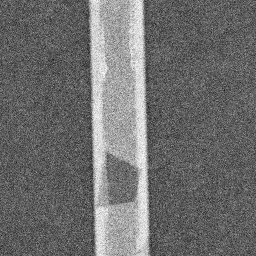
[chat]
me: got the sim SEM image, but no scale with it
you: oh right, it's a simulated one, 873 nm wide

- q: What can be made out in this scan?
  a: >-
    one or a few lines or trenches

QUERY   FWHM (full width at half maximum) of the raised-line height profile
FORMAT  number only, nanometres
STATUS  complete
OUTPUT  152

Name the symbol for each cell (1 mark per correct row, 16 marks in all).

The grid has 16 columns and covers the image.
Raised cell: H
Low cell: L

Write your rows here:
LLLLLLHHHLLLLLLL
LLLLLLHHHLLLLLLL
LLLLLLHHHLLLLLLL
LLLLLLHHHLLLLLLL
LLLLLLHHHLLLLLLL
LLLLLLHHHLLLLLLL
LLLLLLHHHLLLLLLL
LLLLLLHHHLLLLLLL
LLLLLLHHHLLLLLLL
LLLLLLHHHLLLLLLL
LLLLLLHHHLLLLLLL
LLLLLLHHHLLLLLLL
LLLLLLHHHLLLLLLL
LLLLLLHHHLLLLLLL
LLLLLLHHHLLLLLLL
LLLLLLHHHLLLLLLL